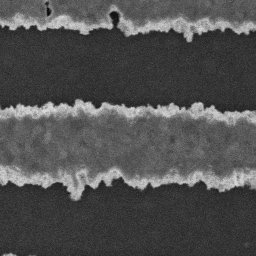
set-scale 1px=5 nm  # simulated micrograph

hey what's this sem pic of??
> one or a few lines or trenches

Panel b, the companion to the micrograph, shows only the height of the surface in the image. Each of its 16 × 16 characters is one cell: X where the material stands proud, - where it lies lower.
XXXXXXXXXXXXXXXX
XXX--XX-XXXXXXXX
----------------
----------------
----------------
----------------
----------------
XXXXXXXXXXXXXXXX
XXXXXXXXXXXXXXXX
XXXXXXXXXXXXXXXX
XXXXXXXXXXXXXXXX
----XX----------
----------------
----------------
----------------
----------------